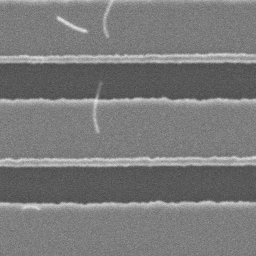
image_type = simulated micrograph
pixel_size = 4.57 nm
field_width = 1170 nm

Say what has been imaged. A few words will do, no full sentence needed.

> lines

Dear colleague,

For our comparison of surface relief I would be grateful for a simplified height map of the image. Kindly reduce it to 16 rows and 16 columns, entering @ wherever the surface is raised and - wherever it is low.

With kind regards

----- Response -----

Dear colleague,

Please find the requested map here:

@@@@@@@@@@@@@@@@
@@@@@@@@@@@@@@@@
@@@@@@@@@@@@@@@@
@@@@@@@@@@@@@@@@
----------------
----------------
@@@@@@@@@@@@@@@@
@@@@@@@@@@@@@@@@
@@@@@@@@@@@@@@@@
@@@@@@@@@@@@@@@@
----------------
----------------
----------------
@@@@@@@@@@@@@@@@
@@@@@@@@@@@@@@@@
@@@@@@@@@@@@@@@@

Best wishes